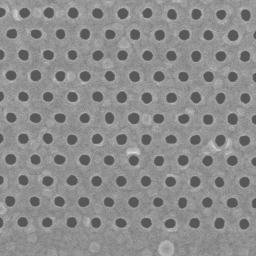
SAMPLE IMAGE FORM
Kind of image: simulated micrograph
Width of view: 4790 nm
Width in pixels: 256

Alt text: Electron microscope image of a regular array of holes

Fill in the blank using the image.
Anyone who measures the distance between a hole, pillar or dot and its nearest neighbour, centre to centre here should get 0.448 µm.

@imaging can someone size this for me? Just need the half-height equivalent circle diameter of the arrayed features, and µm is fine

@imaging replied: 0.204